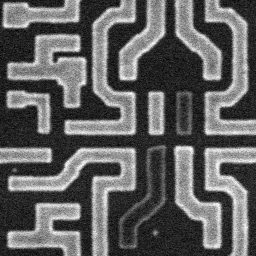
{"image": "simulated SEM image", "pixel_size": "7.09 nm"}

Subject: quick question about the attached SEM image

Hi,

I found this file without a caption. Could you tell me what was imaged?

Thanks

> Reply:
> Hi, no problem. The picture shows wiring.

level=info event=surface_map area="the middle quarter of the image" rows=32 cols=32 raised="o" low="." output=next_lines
ooooo...oo....oooo..............
ooooo...oo....oooo..............
ooooo...oo....oooo..............
ooooo...oo....oooo..............
ooooo...oo......................
oooo....ooo.....................
oooo....oooo....................
oooo....ooooooooo....oooo....oo.
oooo.....oooooooo....oooo...ooo.
oooo......ooooooo....oooo...ooo.
oooo.........oooo....oooo...ooo.
..............ooo....oooo...ooo.
..............ooo....oooo...ooo.
..............ooo....oooo...ooo.
.oooooooooooooooo....oooo...ooo.
ooooooooooooooooo....oooo...ooo.
ooooooooooooooooo....oooo...ooo.
................................
................................
................................
........................o.......
....ooooooooooooo....oooo...oooo
...oooooooooooooo....oooo...oooo
..ooooooooooooooo....oooo...oooo
.ooooo........ooo....oooo...oooo
ooooo.........ooo....oooo...oooo
oooo..........ooo....oooo...oooo
oooo..........ooo....oooo...oooo
ooo.....ooooooooo....oooo...oooo
oo......ooooooooo....oooo...oooo
o.......ooooooooo....oooo...oooo
........ooo..........oooo...oooo